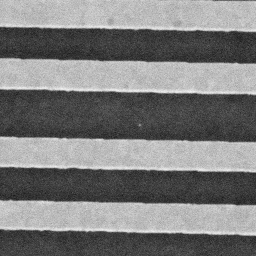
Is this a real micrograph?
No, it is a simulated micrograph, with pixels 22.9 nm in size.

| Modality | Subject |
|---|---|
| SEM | lines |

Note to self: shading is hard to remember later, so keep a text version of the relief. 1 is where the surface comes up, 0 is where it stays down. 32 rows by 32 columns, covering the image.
11111111111111111111111111111111
11111111111111111111111111111111
11111111111111111111111111111111
00000000000000011111111111111111
00000000000000000000000000000000
00000000000000000000000000000000
00000000000000000000000000000000
11100000000000000000000000000000
11111111111111111111111111111111
11111111111111111111111111111111
11111111111111111111111111111111
00000000000000000001011111111111
00000000000000000000000000000000
00000000000000000000000000000000
00000000000000000000000000000000
00000000000000000000000000000000
00000000000000000000000000000000
11111111111110000000000000000000
11111111111111111111111111111111
11111111111111111111111111111111
11111111111111111111111111111111
00000000000000000000000000000000
00000000000000000000000000000000
00000000000000000000000000000000
00000000000000000000000000000000
11111111111111111100000000000000
11111111111111111111111111111111
11111111111111111111111111111111
11111111111111111111111111111111
00000000000000000000000000000000
00000000000000000000000000000000
00000000000000000000000000000000